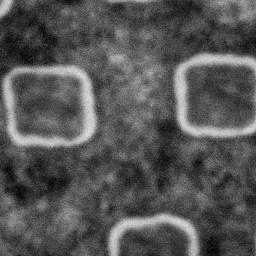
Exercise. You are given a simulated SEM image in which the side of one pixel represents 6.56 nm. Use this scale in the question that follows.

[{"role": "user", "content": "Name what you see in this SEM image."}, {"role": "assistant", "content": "raised bodies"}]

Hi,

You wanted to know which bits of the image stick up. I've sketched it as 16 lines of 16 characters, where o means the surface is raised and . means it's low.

................
................
................
................
.oooo......ooooo
oooooo.....ooooo
oooooo.....ooooo
.ooooo.....ooooo
.oooo...........
................
................
................
................
................
.......ooooo....
.......ooooo....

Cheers